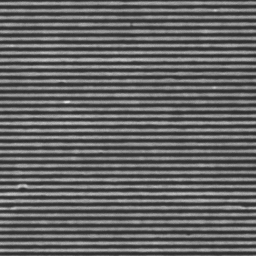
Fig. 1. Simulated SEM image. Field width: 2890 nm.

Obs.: parallel lines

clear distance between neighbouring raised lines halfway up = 45.2 nanometers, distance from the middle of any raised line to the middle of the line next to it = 7.05 pixels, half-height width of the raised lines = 33.9 nm